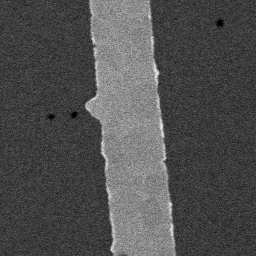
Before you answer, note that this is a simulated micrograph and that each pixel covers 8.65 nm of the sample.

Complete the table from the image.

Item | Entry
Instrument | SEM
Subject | one or a few lines or trenches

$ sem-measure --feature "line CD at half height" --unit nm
522